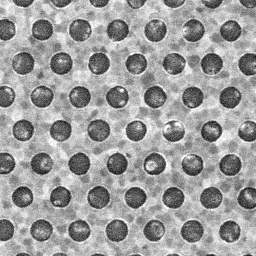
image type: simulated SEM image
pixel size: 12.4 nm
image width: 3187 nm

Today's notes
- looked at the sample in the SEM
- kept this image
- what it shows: a regular array of holes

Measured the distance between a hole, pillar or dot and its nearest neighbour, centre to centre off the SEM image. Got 0.468 µm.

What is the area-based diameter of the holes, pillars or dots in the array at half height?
286 nm